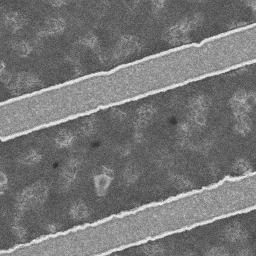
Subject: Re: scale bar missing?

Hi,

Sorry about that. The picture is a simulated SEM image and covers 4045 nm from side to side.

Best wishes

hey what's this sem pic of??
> one or a few lines or trenches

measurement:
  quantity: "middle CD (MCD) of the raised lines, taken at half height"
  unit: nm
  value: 538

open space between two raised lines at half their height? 1680 nanometers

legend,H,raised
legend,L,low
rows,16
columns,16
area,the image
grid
LLLLLLLLLLLLLLLL
LLLLLLLLLLLLLLLL
LLLLLLLLLLLLLHHH
LLLLLLLLLLHHHHHH
LLLLLLLHHHHHHHLL
LLLHHHHHHHHLLLLL
HHHHHHHLLLLLLLLL
HHHHLLLLLLLLLLLL
HLLLLLLLLLLLLLLL
LLLLLLLLLLLLLLLL
LLLLLLLLLLLLLLLL
LLLLLLLLLLLLLLHH
LLLLLLLLLLLHHHHH
LLLLLLLHHHHHHHLL
LLLLHHHHHHHLLLLL
LHHHHHHHLLLLLLLL